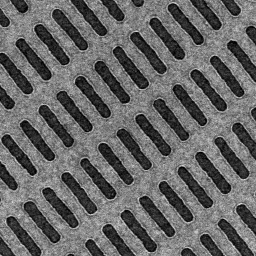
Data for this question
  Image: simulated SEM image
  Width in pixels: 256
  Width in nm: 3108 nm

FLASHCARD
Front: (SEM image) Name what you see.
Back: a regular array of holes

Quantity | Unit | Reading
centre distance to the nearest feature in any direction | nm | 285